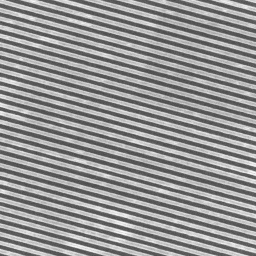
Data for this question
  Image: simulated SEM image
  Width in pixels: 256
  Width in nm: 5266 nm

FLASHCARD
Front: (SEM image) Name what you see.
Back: parallel lines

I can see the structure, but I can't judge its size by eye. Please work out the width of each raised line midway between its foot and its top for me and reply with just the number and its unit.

79.5 nm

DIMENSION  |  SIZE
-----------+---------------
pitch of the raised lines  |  171 nm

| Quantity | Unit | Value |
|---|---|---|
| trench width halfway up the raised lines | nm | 94.4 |